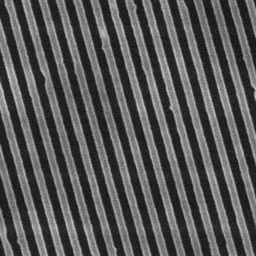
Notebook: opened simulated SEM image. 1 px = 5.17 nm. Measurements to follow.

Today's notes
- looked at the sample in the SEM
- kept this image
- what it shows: parallel lines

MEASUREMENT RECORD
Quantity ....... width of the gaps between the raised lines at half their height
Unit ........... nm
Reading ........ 50.5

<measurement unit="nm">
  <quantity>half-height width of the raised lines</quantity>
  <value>35.5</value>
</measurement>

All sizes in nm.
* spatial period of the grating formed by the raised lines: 85.8